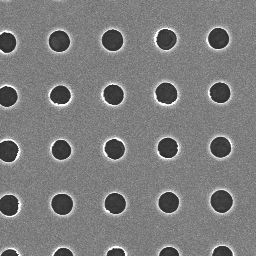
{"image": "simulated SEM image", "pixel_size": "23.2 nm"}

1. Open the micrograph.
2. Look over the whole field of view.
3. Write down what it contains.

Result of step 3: a regular array of holes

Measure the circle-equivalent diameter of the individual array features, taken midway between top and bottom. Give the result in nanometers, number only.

485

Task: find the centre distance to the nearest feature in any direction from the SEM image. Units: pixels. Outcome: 52.9